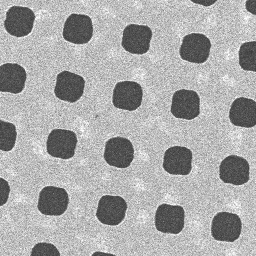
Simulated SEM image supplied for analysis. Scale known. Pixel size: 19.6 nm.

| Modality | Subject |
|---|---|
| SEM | a regular array of holes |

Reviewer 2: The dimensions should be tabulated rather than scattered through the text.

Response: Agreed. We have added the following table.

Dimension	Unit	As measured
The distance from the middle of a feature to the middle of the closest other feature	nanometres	1130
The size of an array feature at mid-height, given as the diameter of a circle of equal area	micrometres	0.611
